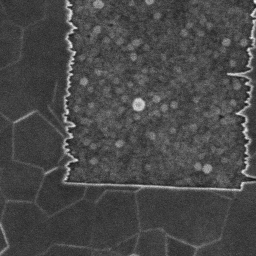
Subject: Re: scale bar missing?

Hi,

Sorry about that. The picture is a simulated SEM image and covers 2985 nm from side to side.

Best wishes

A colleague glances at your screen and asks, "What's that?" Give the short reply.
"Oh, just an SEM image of one or a few lines or trenches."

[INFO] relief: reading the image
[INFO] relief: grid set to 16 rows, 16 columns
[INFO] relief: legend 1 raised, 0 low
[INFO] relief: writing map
1111000000000000
1111100000000000
1111000000000000
1111100000000000
1111000000000001
1111000000000000
1111000010000001
1111000000000001
1111000000000001
1111000000000001
1111000000000001
1111110000000001
1111111111111111
1111111111111111
1111111111111111
1111111111111111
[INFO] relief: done